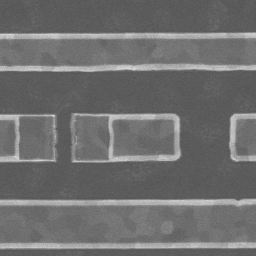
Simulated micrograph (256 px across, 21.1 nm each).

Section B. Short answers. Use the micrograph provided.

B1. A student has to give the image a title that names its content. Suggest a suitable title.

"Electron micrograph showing one or a few lines or trenches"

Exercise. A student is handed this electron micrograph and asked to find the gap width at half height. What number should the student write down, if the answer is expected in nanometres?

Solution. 962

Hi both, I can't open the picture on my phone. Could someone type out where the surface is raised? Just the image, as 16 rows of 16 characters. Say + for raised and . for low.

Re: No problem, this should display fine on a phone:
................
................
++++++++++++++++
++++++++++++++++
................
................
................
+......++++....+
+......++++...++
+......++++....+
................
................
................
++++++++++++++++
++++++++++++++++
................